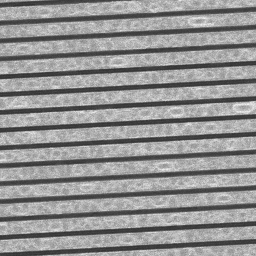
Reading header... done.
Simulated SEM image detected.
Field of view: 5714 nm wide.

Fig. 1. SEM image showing parallel lines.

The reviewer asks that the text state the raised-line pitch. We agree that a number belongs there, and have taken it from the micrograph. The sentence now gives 398 nm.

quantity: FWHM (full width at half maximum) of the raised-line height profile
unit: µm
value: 0.295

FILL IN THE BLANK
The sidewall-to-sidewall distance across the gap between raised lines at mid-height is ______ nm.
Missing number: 100